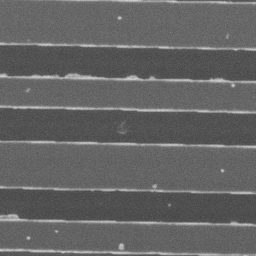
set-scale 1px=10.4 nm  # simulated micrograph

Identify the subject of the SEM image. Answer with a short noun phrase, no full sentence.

lines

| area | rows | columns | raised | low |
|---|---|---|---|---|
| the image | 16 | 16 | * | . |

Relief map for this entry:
****************
****************
****************
................
................
****************
****************
................
................
****************
****************
****************
................
................
****************
****************